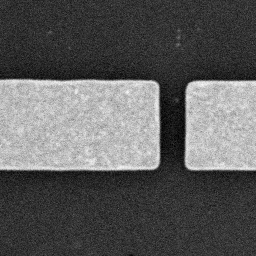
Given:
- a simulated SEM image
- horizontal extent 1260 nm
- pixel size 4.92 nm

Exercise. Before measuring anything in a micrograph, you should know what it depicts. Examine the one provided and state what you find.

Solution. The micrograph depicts wiring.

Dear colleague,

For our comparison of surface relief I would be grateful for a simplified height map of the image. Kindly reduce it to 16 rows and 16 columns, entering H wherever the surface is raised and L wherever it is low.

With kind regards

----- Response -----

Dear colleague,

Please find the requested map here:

LLLLLLLLLLLLLLLL
LLLLLLLLLLLLLLLL
LLLLLLLLLLLLLLLL
LLLLLLLLLLLLLLLL
LLLLLLLLLLLLLLLL
HHHHHHHHHHLLHHHH
HHHHHHHHHHLLHHHH
HHHHHHHHHHLLHHHH
HHHHHHHHHHLLHHHH
HHHHHHHHHHLLHHHH
HHHHHHHHHLLLHHHH
LLLLLLLLLLLLLLLL
LLLLLLLLLLLLLLLL
LLLLLLLLLLLLLLLL
LLLLLLLLLLLLLLLL
LLLLLLLLLLLLLLLL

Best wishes